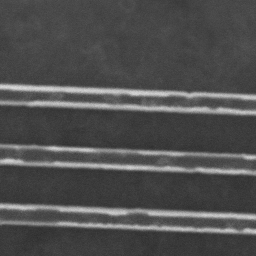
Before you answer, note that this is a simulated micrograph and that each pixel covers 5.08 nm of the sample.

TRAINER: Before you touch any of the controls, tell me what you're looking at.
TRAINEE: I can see parallel lines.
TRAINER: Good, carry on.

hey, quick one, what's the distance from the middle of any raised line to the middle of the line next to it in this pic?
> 303 nm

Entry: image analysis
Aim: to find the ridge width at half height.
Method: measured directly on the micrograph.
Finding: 18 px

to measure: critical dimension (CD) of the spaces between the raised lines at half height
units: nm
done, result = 211